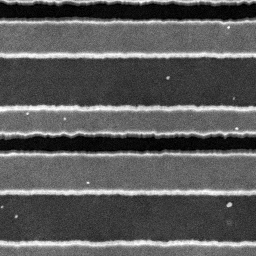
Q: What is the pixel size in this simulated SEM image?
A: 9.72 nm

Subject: lines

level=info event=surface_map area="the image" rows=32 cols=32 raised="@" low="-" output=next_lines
--------------------------------
--------------------------------
---------@----------------------
@@@@@@@@@@@@@@@@@@@@@@@@@@@@@@@@
@@@@@@@@@@@@@@@@@@@@@@@@@@@@@@@@
@@@@@@@@@@@@@@@@@@@@@@@@@@@@@@@@
@@@@@@@@@@@@@@@@@@@@@@@@@@@@@@@@
--------------------------------
--------------------------------
--------------------------------
--------------------------------
--------------------------------
--------------------------------
--------------------------------
@@@@@@@@@@@@@@@@@@@@@@@@@@@@@@@@
@@@@@@@@@@@@@@@@@@@@@@@@@@@@@@@@
@@@@@@@@@@@@@@@@@@@@@@@@@@@@@@@@
--------------------------------
--------------------------------
@@@@@@@@@@@@@@@@@@@@@@@@@@@@@@@@
@@@@@@@@@@@@@@@@@@@@@@@@@@@@@@@@
@@@@@@@@@@@@@@@@@@@@@@@@@@@@@@@@
@@@@@@@@@@@@@@@@@@@@@@@@@@@@@@@@
@@@@@@@@@@@@@@@@@@@@@@@@@@@@@@@@
--------------------------------
--------------------------------
--------------------------------
--------------------------------
--------------------------------
--------------------------------
----@----@-------@@---@@@-------
@@@@@@@@@@@@@@@@@@@@@@@@@@@@@@@@